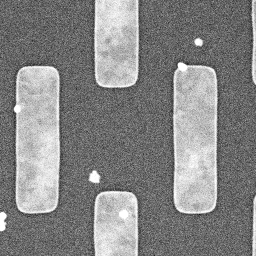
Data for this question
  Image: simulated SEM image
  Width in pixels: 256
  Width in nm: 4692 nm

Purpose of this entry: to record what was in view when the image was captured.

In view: groups of lines, slits or small figures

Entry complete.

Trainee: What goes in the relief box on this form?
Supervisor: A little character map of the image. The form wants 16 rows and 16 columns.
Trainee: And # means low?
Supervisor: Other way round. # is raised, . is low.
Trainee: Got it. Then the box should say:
......###.......
......###.......
......###.......
......###.......
.##...###..##...
.###.......###..
.###.......###..
.###.......###..
.###.......##...
.###.......##...
.###.......##...
.###.......###..
.###..##...##...
......###.......
......###.......
......###.......